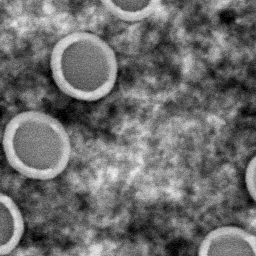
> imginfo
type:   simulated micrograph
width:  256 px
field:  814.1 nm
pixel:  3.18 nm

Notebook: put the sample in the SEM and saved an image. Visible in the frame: raised bodies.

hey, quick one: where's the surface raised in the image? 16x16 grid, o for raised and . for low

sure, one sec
.......ooo......
................
....oo..........
...oooo.........
...oooo.........
....ooo.........
................
.oo.............
oooo............
oooo............
.ooo............
................
................
o...............
o.............o.
o............ooo